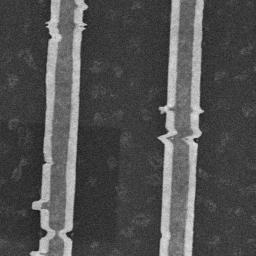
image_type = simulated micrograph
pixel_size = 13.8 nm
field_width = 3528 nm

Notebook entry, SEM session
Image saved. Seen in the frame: one or a few lines or trenches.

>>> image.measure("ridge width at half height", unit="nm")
365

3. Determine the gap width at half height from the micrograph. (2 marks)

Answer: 1310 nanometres